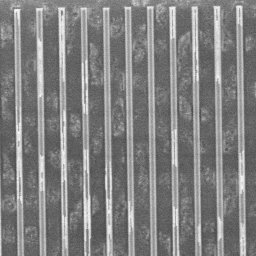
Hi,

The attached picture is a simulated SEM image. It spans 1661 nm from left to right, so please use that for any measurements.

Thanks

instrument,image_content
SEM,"parallel lines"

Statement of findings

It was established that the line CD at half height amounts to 37.3 nanometres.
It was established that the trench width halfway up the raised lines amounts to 0.105 microns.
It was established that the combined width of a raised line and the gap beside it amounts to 144 nm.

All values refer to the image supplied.